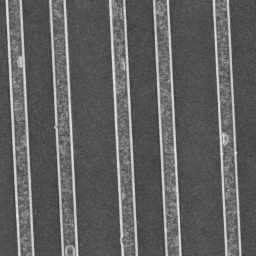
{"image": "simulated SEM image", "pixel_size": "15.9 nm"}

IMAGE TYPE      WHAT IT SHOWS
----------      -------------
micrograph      parallel lines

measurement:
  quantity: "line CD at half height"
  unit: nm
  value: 227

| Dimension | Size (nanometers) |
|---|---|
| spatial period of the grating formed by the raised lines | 824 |